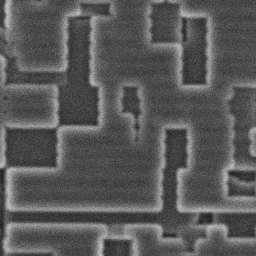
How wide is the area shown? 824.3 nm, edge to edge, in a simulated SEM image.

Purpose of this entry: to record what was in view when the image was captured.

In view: wiring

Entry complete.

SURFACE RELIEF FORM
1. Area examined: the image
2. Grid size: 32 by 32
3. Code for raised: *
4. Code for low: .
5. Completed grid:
.*********...******...**********
.*********....*****...**********
.*******...********.......******
.*******...********.......******
.*******...********.......******
..******...**********.....******
..******...************...******
*.******...************...******
*.******...************...******
*..........************...******
*..........************...******
*******.....***..************...
*******.....***...***********...
*******.....***...***********...
*******.....*****************...
*******.....*****************...
*......**************..******..*
*......*************....*****..*
*......**************...*****..*
*......**************...*****...
*......**************..******...
.*******************..******....
.*******************..******....
.*******************..******....
.*******************..*******...
.*******************..**********
................................
................................
.************...****......**....
.************...****......***...
.************....******.********
.************....******.********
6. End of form